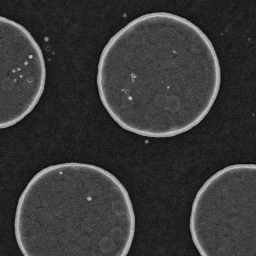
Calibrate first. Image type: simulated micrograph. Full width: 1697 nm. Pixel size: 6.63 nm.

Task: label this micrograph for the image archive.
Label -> raised bodies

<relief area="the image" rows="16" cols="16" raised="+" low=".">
................
+.......++++....
++.....++++++...
+++...+++++++...
+++...++++++++..
+++...++++++++..
++.....++++++...
+......+++++....
................
................
...+++........++
..+++++......+++
.+++++++....++++
.+++++++....++++
.+++++++....++++
.+++++++....++++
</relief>